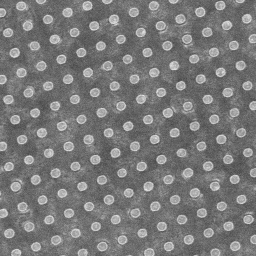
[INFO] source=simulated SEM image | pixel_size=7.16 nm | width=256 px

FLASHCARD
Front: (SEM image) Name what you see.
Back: a regular array of raised bodies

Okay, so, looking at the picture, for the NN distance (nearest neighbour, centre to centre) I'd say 150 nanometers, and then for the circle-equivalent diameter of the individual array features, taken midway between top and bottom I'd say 64.2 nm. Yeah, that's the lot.